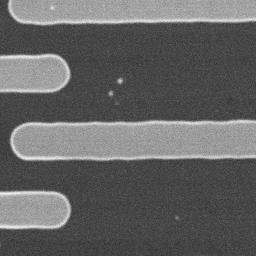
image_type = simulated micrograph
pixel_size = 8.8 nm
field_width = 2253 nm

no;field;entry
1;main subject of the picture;groups of lines, slits or small figures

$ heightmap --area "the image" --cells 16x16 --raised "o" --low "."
.ooooooooooooooo
..o.............
................
..o.............
oooo............
oooo............
................
................
.ooooooooooooooo
.ooooooooooooooo
................
................
oooo............
oooo............
................
................